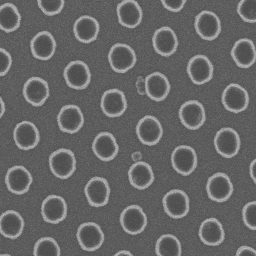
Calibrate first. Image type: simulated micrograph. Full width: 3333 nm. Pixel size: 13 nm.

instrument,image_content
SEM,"a regular array of raised bodies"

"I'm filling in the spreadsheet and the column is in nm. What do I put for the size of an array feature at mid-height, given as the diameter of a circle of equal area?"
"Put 330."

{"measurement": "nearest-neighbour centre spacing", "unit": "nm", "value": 584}